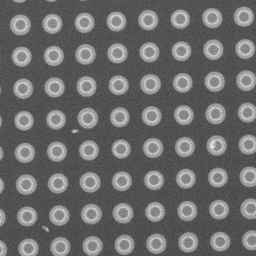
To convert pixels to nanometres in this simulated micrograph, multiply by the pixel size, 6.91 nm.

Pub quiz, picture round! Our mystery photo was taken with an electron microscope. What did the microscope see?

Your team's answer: an array of small figures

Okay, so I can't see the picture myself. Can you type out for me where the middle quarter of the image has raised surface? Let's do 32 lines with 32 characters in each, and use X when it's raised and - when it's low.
--------------------------------
--------------------------------
-----------------------------X--
----XXX-----XXX-----XXXX----XXXX
---XXXXX---XXXXX---XXXXX---XXXXX
---XXXXX---XXXXX---XXXXX---XXXXX
---XXXXX----XXXX----XXXX----XXX-
----XXX------XX-----------------
--------------------------------
--------------------------------
-----------------------------XX-
-----XX-----XXXX----XXXX----XXXX
----XXXX----XXXX----XXXX----XXXX
----XXXX----XXXX----XXXX----XXXX
----XXXX----XXXX----XXXX----XXXX
----XXXX-----XX-----------------
--------------------------------
--------------------------------
-----------------------------XX-
-----XXX-----XXX----XXXX----XXXX
----XXXX----XXXX----XXXXX---XXXX
X---XXXXX---XXXXX---XXXXX---XXXX
X---XXXX----XXXX----XXXX----XXXX
-----XXX------------------------
--------------------------------
--------------------------------
-----------------------------XX-
-----XXX-----XXX-----XXX----XXXX
X---XXXXX---XXXXX---XXXXX---XXXX
X---XXXXX---XXXXX---XXXXX---XXXX
X---XXXXX---XXXXX----XXX-----XXX
-----XXX------X-----------------